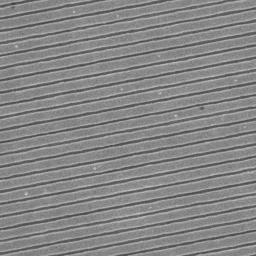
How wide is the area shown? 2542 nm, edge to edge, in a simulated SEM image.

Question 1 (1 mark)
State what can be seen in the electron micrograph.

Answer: parallel lines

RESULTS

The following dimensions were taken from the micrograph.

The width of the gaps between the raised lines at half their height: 28.1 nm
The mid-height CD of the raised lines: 9.47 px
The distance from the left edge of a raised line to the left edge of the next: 121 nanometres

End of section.